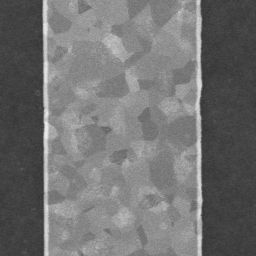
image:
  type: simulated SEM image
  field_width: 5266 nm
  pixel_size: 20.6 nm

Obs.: one or a few lines or trenches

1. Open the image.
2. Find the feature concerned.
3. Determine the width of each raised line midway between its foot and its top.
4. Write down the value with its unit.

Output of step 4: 153 pixels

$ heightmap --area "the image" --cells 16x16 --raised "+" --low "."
...+++++++++....
...+++++++++....
...+++++++++....
...+++++++++....
...+++++++++....
...+++++++++....
...+++++++++....
...+++++++++....
...+++++++++....
...+++++++++....
...+++++++++....
...+++++++++....
...+++++++++....
...+++++++++....
...+++++++++....
...+++++++++....